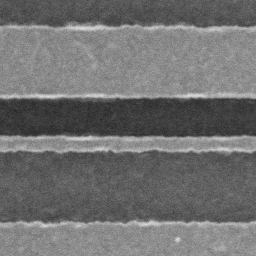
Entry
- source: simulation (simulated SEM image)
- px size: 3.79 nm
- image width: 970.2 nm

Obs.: lines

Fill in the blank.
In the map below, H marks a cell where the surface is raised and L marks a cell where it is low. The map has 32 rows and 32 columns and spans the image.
LLLLLLLLLLLLLLLLLLLLLLLLLLLLLLLL
LLLLLLLLLLLLLLLLLLLLLLLLLLLLLLLL
LLLLLLLLLLLLLLLLLLLLLLLLLLLLLLLL
HHHHHHHHHHHHHHHHHHHHHHHHHLHHHHHH
HHHHHHHHHHHHHHHHHHHHHHHHHHHHHHHH
HHHHHHHHHHHHHHHHHHHHHHHHHHHHHHHH
HHHHHHHHHHHHHHHHHHHHHHHHHHHHHHHH
HHHHHHHHHHHHHHHHHHHHHHHHHHHHHHHH
HHHHHHHHHHHHHHHHHHHHHHHHHHHHHHHH
HHHHHHHHHHHHHHHHHHHHHHHHHHHHHHHH
HHHHHHHHHHHHHHHHHHHHHHHHHHHHHHHH
HHHHHHHHHHHHHHHHHHHHHHHHHHHHHHHH
LLLLLLLLLLLLLLLLLLLLLLLLLLLLLLLL
LLLLLLLLLLLLLLLLLLLLLLLLLLLLLLLL
LLLLLLLLLLLLLLLLLLLLLLLLLLLLLLLL
LLLLLLLLLLLLLLLLLLLLLLLLLLLLLLLL
LLLLLLLLLLLLLLLLLLLLLLLLLLLLLLLL
HHHHHHHHHHHHHHHHHHHHHHHHHHHHHHHH
HHHHHHHHHHHHHHHHHHHHHHHHHHHHHHHH
LLLLLLLLLLLLLLLLLLLLLLLLLLLLLLLL
LLLLLLLLLLLLLLLLLLLLLLLLLLLLLLLL
LLLLLLLLLLLLLLLLLLLLLLLLLLLLLLLL
LLLLLLLLLLLLLLLLLLLLLLLLLLLLLLLL
LLLLLLLLLLLLLLLLLLLLLLLLLLLLLLLL
LLLLLLLLLLLLLLLLLLLLLLLLLLLLLLLL
LLLLLLLLLLLLLLLLLLLLLLLLLLLLLLLL
LLLLLLLLLLLLLLLLLLLLLLLLLLLLLLLL
LLLLLLLLLLLLLLLLLLLLLLLLLLLLLLLL
HHHHHHHHHHHHHHHHHHHHHHHHHHHHHHHH
HHHHHHHHHHHHHHHHHHHHHHHHHHHHHHHH
HHHHHHHHHHHHHHHHHHHHHHHHHHHHHHHH
HHHHHHHHHHHHHHHHHHHHHHHHHHHHHHHH